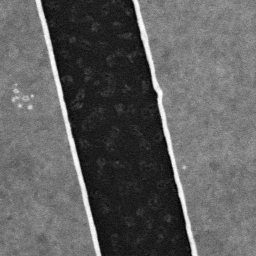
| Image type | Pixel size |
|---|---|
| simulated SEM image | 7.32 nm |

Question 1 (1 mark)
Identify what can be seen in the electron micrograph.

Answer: one or a few lines or trenches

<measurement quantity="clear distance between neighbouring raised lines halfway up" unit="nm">697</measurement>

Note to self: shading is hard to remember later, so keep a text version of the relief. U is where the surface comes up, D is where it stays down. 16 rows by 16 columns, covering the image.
UUDDDDDDDUUUUUUU
UUUDDDDDDUUUUUUU
UUUDDDDDDUUUUUUU
UUUDDDDDDUUUUUUU
UUUDDDDDDDUUUUUU
UUUUDDDDDDUUUUUU
UUUUDDDDDDUUUUUU
UUUUDDDDDDUUUUUU
UUUUDDDDDDUUUUUU
UUUUUDDDDDDUUUUU
UUUUUDDDDDDUUUUU
UUUUUDDDDDDUUUUU
UUUUUDDDDDDUUUUU
UUUUUUDDDDDDUUUU
UUUUUUDDDDDDUUUU
UUUUUUDDDDDDUUUU